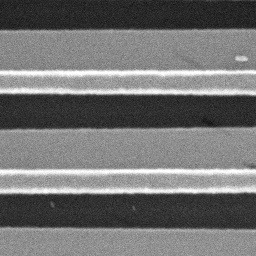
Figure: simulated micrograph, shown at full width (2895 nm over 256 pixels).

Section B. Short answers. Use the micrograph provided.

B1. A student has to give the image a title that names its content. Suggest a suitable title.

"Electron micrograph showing lines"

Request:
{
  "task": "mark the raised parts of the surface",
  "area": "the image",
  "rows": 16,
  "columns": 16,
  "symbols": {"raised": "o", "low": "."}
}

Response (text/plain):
................
................
oooooooooooooooo
oooooooooooooooo
oooooooooooooooo
oooooooooooooooo
................
................
oooooooooooooooo
oooooooooooooooo
oooooooooooooooo
oooooooooooooooo
................
................
oooooooooooooooo
oooooooooooooooo